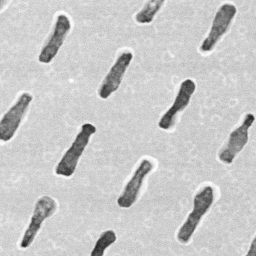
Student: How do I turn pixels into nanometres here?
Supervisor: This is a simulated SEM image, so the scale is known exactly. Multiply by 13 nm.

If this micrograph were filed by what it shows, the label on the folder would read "a regular array of holes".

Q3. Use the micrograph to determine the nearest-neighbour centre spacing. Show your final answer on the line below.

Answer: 898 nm